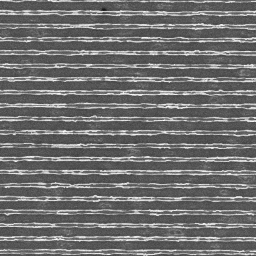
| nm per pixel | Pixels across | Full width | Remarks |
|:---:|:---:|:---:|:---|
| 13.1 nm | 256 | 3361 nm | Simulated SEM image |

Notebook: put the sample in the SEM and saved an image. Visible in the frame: parallel lines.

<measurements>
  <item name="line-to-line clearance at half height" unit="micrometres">0.125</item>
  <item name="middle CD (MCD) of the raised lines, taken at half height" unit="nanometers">46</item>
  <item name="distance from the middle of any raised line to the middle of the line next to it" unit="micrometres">0.174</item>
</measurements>